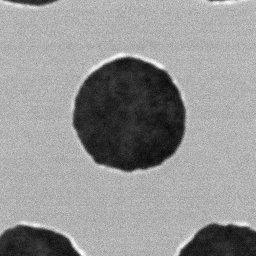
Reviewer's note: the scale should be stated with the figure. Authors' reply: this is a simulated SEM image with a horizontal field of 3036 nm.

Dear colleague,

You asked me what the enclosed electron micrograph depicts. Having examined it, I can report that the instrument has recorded holes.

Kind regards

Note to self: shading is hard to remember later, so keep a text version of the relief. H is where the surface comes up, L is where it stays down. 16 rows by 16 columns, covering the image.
HHHHHHHHHHHHHHHH
HHHHHHHHHHHHHHHH
HHHHHHHHHHHHHHHH
HHHHHHHHHHHHHHHH
HHHHHHLLLLHHHHHH
HHHHHLLLLLLHHHHH
HHHHHLLLLLLLHHHH
HHHHHLLLLLLLHHHH
HHHHHLLLLLLLHHHH
HHHHHLLLLLLHHHHH
HHHHHHHLLHHHHHHH
HHHHHHHHHHHHHHHH
HHHHHHHHHHHHHHHH
HHHHHHHHHHHHHHHH
LLLLHHHHHHHHLLLL
LLLLLHHHHHHLLLLL